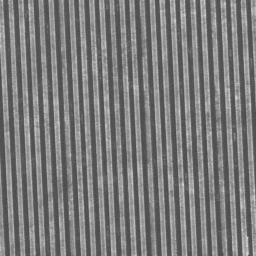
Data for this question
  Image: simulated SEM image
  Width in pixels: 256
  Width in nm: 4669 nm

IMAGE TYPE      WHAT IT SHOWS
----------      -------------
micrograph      parallel lines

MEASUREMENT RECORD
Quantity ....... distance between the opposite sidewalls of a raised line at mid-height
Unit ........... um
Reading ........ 0.066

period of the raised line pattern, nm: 184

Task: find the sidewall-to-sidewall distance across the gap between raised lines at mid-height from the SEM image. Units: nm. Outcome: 114